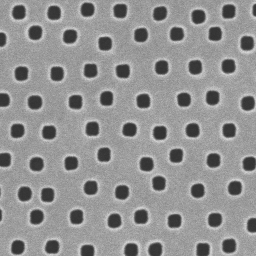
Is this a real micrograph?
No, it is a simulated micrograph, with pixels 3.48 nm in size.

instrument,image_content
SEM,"a regular array of holes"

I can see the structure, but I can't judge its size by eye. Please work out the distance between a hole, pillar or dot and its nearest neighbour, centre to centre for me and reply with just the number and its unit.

29.9 pixels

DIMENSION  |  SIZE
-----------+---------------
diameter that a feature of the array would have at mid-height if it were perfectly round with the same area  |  0.0497 microns